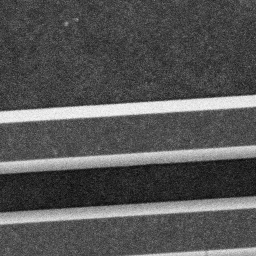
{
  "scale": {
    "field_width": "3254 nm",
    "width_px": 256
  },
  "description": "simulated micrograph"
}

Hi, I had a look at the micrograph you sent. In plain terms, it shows one or a few lines or trenches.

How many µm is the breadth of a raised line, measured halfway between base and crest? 0.675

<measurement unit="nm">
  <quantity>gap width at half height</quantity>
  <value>607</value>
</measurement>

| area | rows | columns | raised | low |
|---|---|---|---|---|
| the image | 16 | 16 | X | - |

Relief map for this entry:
----------------
----------------
----------------
----------------
----------------
----------------
------------XXXX
XXXXXXXXXXXXXXXX
XXXXXXXXXXXXXXXX
XXXXXXXXXXXXXXXX
X---------------
----------------
----------------
-XXXXXXXXXXXXXXX
XXXXXXXXXXXXXXXX
XXXXXXXXXXXXXXXX